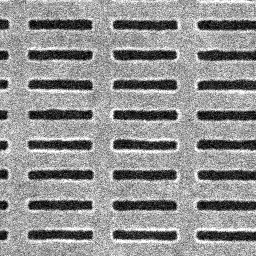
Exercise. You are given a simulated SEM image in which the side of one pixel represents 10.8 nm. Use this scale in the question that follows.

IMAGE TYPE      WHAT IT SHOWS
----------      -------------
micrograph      a regular array of holes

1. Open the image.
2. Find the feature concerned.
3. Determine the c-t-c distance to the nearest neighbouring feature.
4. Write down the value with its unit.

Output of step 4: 317 nanometers